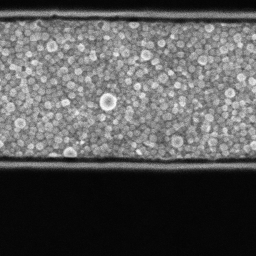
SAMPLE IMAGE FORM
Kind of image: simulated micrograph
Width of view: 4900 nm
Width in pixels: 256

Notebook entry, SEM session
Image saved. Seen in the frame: one or a few lines or trenches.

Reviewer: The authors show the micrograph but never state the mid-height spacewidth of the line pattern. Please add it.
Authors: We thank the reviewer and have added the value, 2870 nanometers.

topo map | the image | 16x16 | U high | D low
UUUUUUUUUUUUUUUU
DDDDDDDDDDDDDDDD
DDDDDDDDDDDDDDDD
DDDDDDDDDDDDDDDD
DDDDDDDDDDDDDDDD
DDDDDDDDDDDDDDDD
DDDDDDDDDDDDDDDD
DDDDDDDDDDDDDDDD
DDDDDDDDDDDDDDDD
DDDDDDDDDDDDDDDD
UUUUUUUUUUUUUUUU
UUUUUUUUUUUUUUUU
UUUUUUUUUUUUUUUU
UUUUUUUUUUUUUUUU
UUUUUUUUUUUUUUUU
UUUUUUUUUUUUUUUU